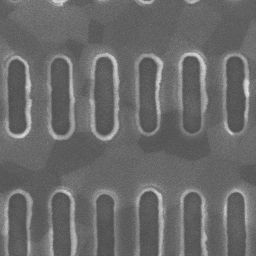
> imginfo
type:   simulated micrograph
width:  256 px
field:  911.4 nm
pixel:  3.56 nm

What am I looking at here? holes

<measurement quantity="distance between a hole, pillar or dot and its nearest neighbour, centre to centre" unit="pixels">43.7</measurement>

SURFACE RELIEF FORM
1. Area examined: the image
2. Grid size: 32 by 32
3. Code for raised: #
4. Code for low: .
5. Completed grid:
################################
################################
################################
################################
################################
################################
################################
#######.####..####.####..###..##
#..###...###..###...###..###...#
#..###...###..###...###..###...#
#..###...###..###...###..###..##
#..###...###..###..####..###...#
#..###...###..###..####..###...#
#..###...###..###...###..###...#
#..###...###..###...###..###...#
#..###...###..###...###..###...#
#..####.####..####.####..####.##
################################
################################
################################
################################
################################
################################
################################
#..####.####..####..###..####.##
#..###...###..###...###..###...#
#..###...###..###...###..###...#
#..###...###..###...###..###...#
#..####..###..###...###..###...#
#...###..###..###...###..###...#
#...###..###..###...###..###...#
#...###..###..####..###..###...#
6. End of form